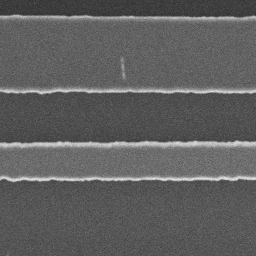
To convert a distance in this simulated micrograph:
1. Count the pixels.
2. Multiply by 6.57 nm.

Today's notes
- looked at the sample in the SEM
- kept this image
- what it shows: lines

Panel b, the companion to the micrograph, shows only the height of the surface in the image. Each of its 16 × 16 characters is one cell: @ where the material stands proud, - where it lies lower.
----------------
@@@@@@@@@@@@@@@@
@@@@@@@@@@@@@@@@
@@@@@@@@@@@@@@@@
@@@@@@@@@@@@@@@@
@@@@@@@@@@@@@@@@
----------------
----------------
----------------
@@@@@@@@@@@@@@@@
@@@@@@@@@@@@@@@@
----------------
----------------
----------------
----------------
----------------